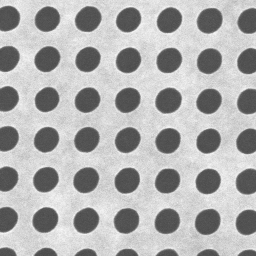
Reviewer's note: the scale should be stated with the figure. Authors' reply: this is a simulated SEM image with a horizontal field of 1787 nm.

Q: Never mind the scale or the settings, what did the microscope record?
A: a regular array of holes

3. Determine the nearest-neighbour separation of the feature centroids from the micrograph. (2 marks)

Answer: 39.9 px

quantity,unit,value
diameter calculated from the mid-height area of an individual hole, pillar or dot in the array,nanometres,172